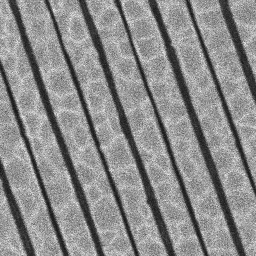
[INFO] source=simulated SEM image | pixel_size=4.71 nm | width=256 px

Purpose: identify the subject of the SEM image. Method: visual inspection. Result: parallel lines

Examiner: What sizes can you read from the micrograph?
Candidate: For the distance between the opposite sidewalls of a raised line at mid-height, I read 130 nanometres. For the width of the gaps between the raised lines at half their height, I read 31.1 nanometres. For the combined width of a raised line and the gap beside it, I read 33.1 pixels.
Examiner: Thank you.